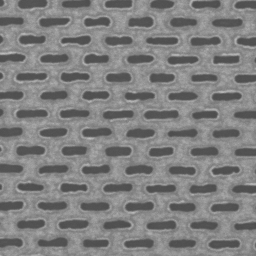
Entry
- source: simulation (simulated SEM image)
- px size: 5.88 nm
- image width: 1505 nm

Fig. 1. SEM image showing a regular array of holes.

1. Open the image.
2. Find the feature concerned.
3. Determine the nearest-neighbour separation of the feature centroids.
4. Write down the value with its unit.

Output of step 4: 162 nanometers